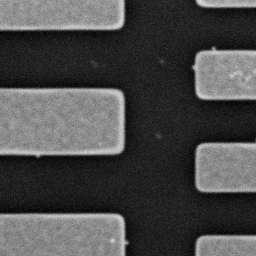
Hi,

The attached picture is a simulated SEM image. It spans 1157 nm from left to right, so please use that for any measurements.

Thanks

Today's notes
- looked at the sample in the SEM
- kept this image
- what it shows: groups of lines, slits or small figures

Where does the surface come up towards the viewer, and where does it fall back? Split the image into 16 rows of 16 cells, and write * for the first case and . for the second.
********........
*******.........
................
............****
............****
............****
********........
********........
********........
*******.....****
............****
............****
................
*******.........
********........
********....****